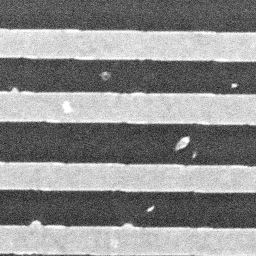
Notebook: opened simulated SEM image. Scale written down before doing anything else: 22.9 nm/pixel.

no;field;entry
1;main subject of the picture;lines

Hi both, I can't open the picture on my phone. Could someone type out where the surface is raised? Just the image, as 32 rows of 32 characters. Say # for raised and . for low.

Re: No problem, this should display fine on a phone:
................................
................................
................................
................................
################################
################################
################################
...........................#####
................................
................................
................................
.##.............................
################################
################################
################################
...............................#
................................
................................
................................
................................
########........................
################################
################################
################################
................................
................................
................................
................................
##################..............
################################
################################
################################